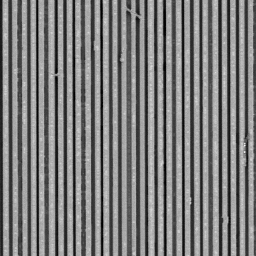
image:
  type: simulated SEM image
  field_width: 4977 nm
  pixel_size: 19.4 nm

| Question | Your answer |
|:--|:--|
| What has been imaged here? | parallel lines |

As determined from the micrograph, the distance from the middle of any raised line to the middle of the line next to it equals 177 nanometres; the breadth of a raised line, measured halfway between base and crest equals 107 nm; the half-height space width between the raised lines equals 3.63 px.